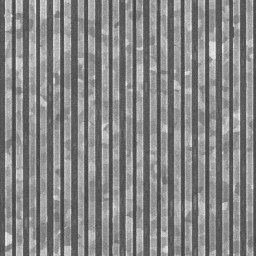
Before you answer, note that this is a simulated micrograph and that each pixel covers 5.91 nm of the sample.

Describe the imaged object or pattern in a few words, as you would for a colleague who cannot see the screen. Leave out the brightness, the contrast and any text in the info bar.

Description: parallel lines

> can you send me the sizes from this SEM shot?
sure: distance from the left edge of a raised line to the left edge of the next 12.1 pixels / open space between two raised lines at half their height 35.1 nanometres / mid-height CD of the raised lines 35.4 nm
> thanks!